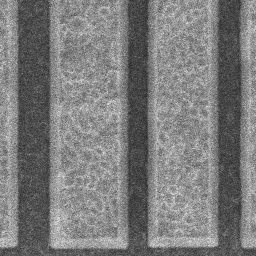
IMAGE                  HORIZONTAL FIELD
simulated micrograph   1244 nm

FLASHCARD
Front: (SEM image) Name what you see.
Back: one or a few lines or trenches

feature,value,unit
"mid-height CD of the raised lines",310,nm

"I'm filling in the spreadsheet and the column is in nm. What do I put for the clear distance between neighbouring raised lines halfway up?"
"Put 162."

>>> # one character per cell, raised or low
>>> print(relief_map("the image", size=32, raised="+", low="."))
+......++++++++....++++++++....+
++.....++++++++....++++++++....+
++.....++++++++....+++++++.....+
++.....++++++++....+++++++.....+
++.....++++++++....+++++++.....+
++.....++++++++....++++++++....+
++.....++++++++....++++++++....+
++.....++++++++....++++++++....+
++.....++++++++....++++++++....+
++.....++++++++....++++++++....+
++.....++++++++....++++++++....+
++.....++++++++....++++++++....+
++.....++++++++....++++++++....+
++.....++++++++....+++++++.....+
++.....++++++++....++++++++....+
++.....++++++++....++++++++....+
++.....++++++++....++++++++....+
+......++++++++....++++++++....+
+......++++++++....++++++++....+
+......++++++++....++++++++....+
++.....++++++++....++++++++....+
++.....++++++++....++++++++....+
++.....++++++++....++++++++....+
+......++++++++....++++++++....+
++.....++++++++....++++++++....+
++.....++++++++....++++++++....+
++.....++++++++....++++++++....+
++.....++++++++....++++++++....+
+......++++++++....++++++++....+
+......++++++++....++++++++....+
................................
................................